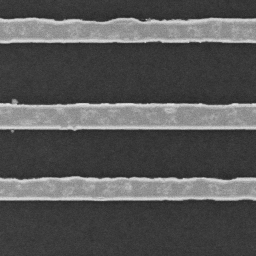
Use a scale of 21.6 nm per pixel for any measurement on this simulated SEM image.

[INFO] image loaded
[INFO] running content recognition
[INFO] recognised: one or a few lines or trenches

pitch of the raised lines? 1710 nanometers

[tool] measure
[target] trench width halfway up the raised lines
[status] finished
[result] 1250 nm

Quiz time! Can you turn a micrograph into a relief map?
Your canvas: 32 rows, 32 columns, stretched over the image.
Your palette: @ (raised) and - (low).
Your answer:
--------------------------------
--------------------------------
---@@---------@@@---------@@----
@@@@@@@@@@@@@@@@@@@@@@@@@@@@@@@@
@@@@@@@@@@@@@@@@@@@@@@@@@@@@@@@@
--------------------------------
--------------------------------
--------------------------------
--------------------------------
--------------------------------
--------------------------------
--------------------------------
--------------------------------
@@@@@@@@@@@@@@@@@@@@@@@@@@@@@@@@
@@@@@@@@@@@@@@@@@@@@@@@@@@@@@@@@
@@@@@@@@@@@@@@@@@@@@@@@@@@@@@@@@
--------------------------------
--------------------------------
--------------------------------
--------------------------------
--------------------------------
--------------------------------
----@@@@@@@--@@@@@@@-@--@@@---@@
@@@@@@@@@@@@@@@@@@@@@@@@@@@@@@@@
@@@@@@@@@@@@@@@@@@@@@@@@@@@@@@@@
--------------------------------
--------------------------------
--------------------------------
--------------------------------
--------------------------------
--------------------------------
--------------------------------